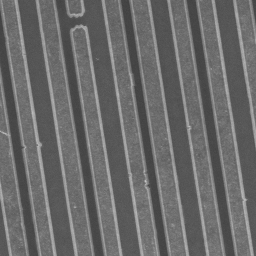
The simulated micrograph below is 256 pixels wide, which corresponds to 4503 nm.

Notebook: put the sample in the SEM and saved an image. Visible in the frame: parallel lines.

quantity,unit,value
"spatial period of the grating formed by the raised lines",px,32.3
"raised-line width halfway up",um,0.289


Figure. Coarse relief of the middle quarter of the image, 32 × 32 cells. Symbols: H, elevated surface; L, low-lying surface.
LLLHHHHLLLLLHHHHLLLHHHHHLLLLLHHH
LLLHHHHLLLLLHHHHLLLHHHHHLLLLLHHH
LLLHHHHLLLLLLHHHHLLHHHHHLLLLLHHH
HLLLHHHLLLLLLHHHHLLLHHHHLLLLLHHH
HLLLHHHLLLLLLHHHHLLLHHHHLLLLLHHH
HLLLHHHHLLLLLHHHHLLLHHHHLLLLLLHH
HLLLHHHHLLLLLHHHHLLLHHHHHLLLLLHH
HLLLHHHHLLLLLHHHHLLLHHHHHLLLLLHH
HLLLHHHHLLLLLHHHHHLLHHHHHLLLLLHH
HHLLHHHHLLLLLLHHHHLLLHHHHLLLLLHH
HHLLLHHHLLLLLLHHHHLLLHHHHLLLLLHH
HHLLLHHHHLLLLLHHHHLLLHHHHLLLLLLH
HHLLLHHHHLLLLLHHHHLLLHHHHLLLLLLH
HHLLLHHHHLLLLLHHHHLLLHHHHHLLLLLH
HHLLLHHHHLLLLLHHHHLLLHHHHHLLLLLH
HHLLLHHHHLLLLLLHHHHLLHHHHHLLLLLH
HHHLLLHHHHLLLLLHHHHLLLHHHHLLLLLH
HHHLLLHHHHLLLLLHHHHLLLHHHHLLLLLH
HHHLLLHHHHLLLLLHHHHLLLHHHHLLLLLH
HHHLLLHHHHLLLLLHHHHLLLHHHHHLLLLL
HHHLLLHHHHLLLLLHHHHLLLHHHHHLLLLL
HHHLLLHHHHLLLLLHHHHLLLHHHHHLLLLL
HHHHLLHHHHLLLLLLHHHHLLLHHHHLLLLL
HHHHLLLHHHHLLLLLHHHHLLLHHHHLLLLL
HHHHLLLHHHHLLLLLHHHHLLLHHHHLLLLL
HHHHLLLHHHHLLLLLHHHHLLLHHHHLLLLL
HHHHLLLHHHHLLLLLHHHHLLLHHHHHLLLL
HHHHLLLHHHHLLLLLHHHHLLLHHHHHLLLL
HHHHLLLHHHHLLLLLLHHHHLLHHHHHLLLL
HHHHHLLHHHHHLLLLLHHHHLLLHHHHLLLL
HHHHHLLLHHHHLLLLLHHHHLLLHHHHLLLL
HHHHHLLLHHHHLLLLLHHHHLLLHHHHLLLL